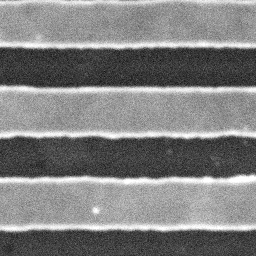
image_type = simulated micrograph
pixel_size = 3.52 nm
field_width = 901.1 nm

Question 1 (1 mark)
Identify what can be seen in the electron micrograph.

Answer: lines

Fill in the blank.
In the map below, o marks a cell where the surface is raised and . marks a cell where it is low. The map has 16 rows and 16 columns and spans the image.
oooooooooooooooo
oooooooooooooooo
oooooooooooooooo
................
................
oo..............
oooooooooooooooo
oooooooooooooooo
o.o...ooo..ooo..
................
................
oooooooooooooooo
oooooooooooooooo
oooooooooooooooo
................
................